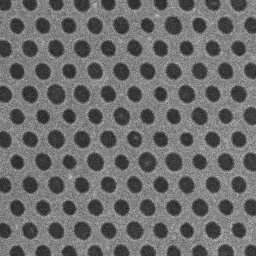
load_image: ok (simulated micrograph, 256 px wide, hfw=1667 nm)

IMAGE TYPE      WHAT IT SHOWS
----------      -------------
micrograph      a regular array of holes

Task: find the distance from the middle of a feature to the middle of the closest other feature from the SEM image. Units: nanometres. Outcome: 168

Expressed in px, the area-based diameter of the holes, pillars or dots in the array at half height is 17.3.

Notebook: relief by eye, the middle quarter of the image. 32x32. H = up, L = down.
LLLHHHLLLHHHLLLLHHHLLLHHHLLLLHHH
LLLHHHLLLLHHLLLLLHHLLLLHHLLLLHHH
LLLHHHLLLLHHLLLLLHHLLLLHHLLLLLHH
LLLHHHLLLHHHHLLLHHHHLLHHHHLLLHHH
HHHHHHHHHHHHHHHHHHHHHHHHHHHHHHHH
HHHLLLHHHHLLHHHHHLHHHHHHHHHHHLLL
HHLLLLHHHLLLLHHHLLLHHHLLLLHHLLLL
LHLLLLLHHLLLLHHHLLLLHHLLLLHHLLLL
LHLLLLHHHLLLLHHHLLLLHHHLLLHHHLLL
HHHHLLHHHHLLHHHHHLLHHHHHLHHHHLLL
HHHHHHHHHHHHHHHHHHHHHHHHHHHHHHHH
LLHHHHLLLHHHLLLLHHHHLLHHHHLLHHHH
LLLHHHLLLLHHLLLLLHHLLLLHHLLLLHHH
LLLHHHLLLLHHLLLLLHHLLLLHHHLLLHHH
LLLHHHLLLLHHHLLLHHHLLLHHHHLLLHHH
HHHHHHHHHHHHHHLHHHHHHHHHHHHHHHHH
HHHHLHHHHHLHHHHHHLHHHHHHHHHHHHHH
HHHLLLHHHLLLLHHHLLLHHHHLLLHHHLLL
HHLLLLLHHLLLLHHHLLLLHHLLLLHHHLLL
HHLLLLLHHLLLLHHHLLLLHHLLLLHHHLLL
HHHLLLHHHHLLLHHHHLLHHHHLLLHHHHLL
HHHHHHHHHHHHHHHHHHHHHHHHHHHHHHHH
HHHHHHLLLHHHHHHHHHHLLLHHHHLLLHHH
LLLHHHLLLLHHHLLLHHLLLLLHHLLLLLHH
LLLHHHLLLLHHLLLLHHLLLLLHHLLLLLHH
LLLHHHLLLLHHHLLLHHHLLLLHHLLLLLHH
HLHHHHHLLLHHHHLHHHHLLLLHHHLLLHHH
HHHHHHHHHHHHHHHHHHHHHHHHHHHHHHHH
HHHLLHHHHHLLHHHHLLLHHHHLLHHHHLLL
HHLLLLHHHLLLLHHHLLLLHHLLLLHHLLLL
HHLLLLLHHLLLLHHHLLLLHHLLLLHHLLLL
HHHLLLHHHHLLLHHHLLLLHHHLLLHHHLLL